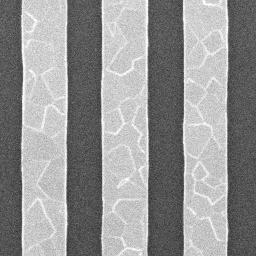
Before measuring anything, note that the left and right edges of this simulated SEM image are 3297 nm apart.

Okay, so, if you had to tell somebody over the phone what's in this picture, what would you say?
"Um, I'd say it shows wiring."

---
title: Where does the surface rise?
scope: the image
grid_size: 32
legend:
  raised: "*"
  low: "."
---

...*****.....*****.....*****....
...*****.....*****.....*****....
...*****.....*****.....*****....
...*****.....*****.....*****....
...*****.....*****.....*****....
...*****.....*****.....*****....
...*****.....*****.....*****....
...*****.....*****.....*****....
...*****.....*****.....*****....
...*****.....*****.....*****....
...*****.....*****.....*****....
...*****.....*****.....*****....
...*****.....*****.....*****....
...*****.....*****.....*****....
...*****.....*****.....*****....
...*****.....*****.....*****....
...*****.....*****.....*****....
...*****.....*****.....*****....
...*****.....*****.....*****....
...*****.....*****.....*****....
...*****.....*****.....*****....
...*****.....*****.....*****....
...*****.....*****.....*****....
...*****.....*****.....*****....
...*****.....*****.....*****....
...*****.....*****.....*****....
...*****.....*****.....*****....
...*****.....*****.....*****....
...*****.....*****.....*****....
...*****.....*****.....*****....
...*****.....*****.....*****....
...*****.....*****.....*****....